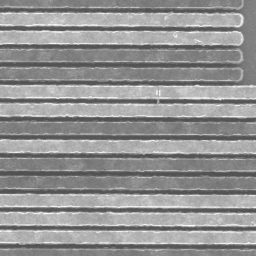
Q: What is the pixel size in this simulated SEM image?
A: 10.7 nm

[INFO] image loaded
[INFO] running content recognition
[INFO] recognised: parallel lines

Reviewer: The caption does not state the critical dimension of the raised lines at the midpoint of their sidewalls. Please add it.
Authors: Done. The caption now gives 142 nanometres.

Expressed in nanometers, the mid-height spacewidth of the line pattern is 48.1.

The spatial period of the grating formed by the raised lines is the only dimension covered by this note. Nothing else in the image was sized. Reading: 0.194 um